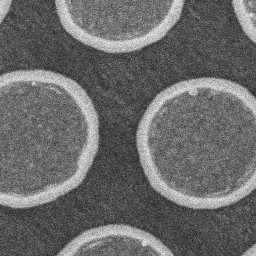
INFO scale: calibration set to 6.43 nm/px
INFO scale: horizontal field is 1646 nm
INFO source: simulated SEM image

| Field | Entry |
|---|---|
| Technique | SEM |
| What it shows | raised bodies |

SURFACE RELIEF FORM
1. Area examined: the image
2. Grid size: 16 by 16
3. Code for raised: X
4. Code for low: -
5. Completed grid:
----XXXXXXX----X
----XXXXXX-----X
-----XXXX-------
----------------
----------------
XXXXX------XXX--
XXXXX-----XXXXXX
XXXXXX---XXXXXXX
XXXXXX---XXXXXXX
XXXXXX---XXXXXXX
XXXXX----XXXXXXX
XXXX------XXXXXX
XX---------XXX--
----------------
------XX--------
----XXXXXX------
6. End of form